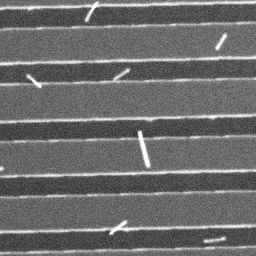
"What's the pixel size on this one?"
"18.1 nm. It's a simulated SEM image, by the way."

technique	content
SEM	lines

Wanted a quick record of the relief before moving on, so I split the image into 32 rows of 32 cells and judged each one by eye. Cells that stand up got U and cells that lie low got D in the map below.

UUUUUUUUUUUUUUUUUUUUUUDDDDDDDDDD
DDDDDDDDDDDDDDDDDDDDDDDDDDDDDDDD
DDDDDDDDDDDDDDDDDDDDDDDDDDDDDDDD
DDDDDDDDDUUUUUUUUUUUUUUUUUUUUUUU
UUUUUUUUUUUUUUUUUUUUUUUUUUUUUUUU
UUUUUUUUUUUUUUUUUUUUUUUUUUUUUUUU
UUUUUUUUUUUUUUUUUUUUUUUUUUUUUUUU
UUUUUUUUUUUUUUUUUUDDDDDDDDDDDDDD
DDDDDDDDDDDDDDDDDDDDDDDDDDDDDDDD
DDDDDDDDDDDDDDDDDDDDDDDDDDDDDDDD
DDDDUUUUUUUUUUUUUUUUUUUUUUUUUUUU
UUUUUUUUUUUUUUUUUUUUUUUUUUUUUUUU
UUUUUUUUUUUUUUUUUUUUUUUUUUUUUUUU
UUUUUUUUUUUUUUUUUUUUUUUUUUUUUUUU
UUUUUUUUUUUUUUUUUUUUUUUUUUUUUUUU
DDDDDDDDDDDDDDDDDDDDDDDDDDDDDDDD
DDDDDDDDDDDDDDDDDDDDDDDDDDDDDDDD
DDDDDDDDDDDUUUUUUUUUUUUUUUUUUUUU
UUUUUUUUUUUUUUUUUUUUUUUUUUUUUUUU
UUUUUUUUUUUUUUUUUUUUUUUUUUUUUUUU
UUUUUUUUUUUUUUUUUUUUUUUUUUUUUUUU
UUUUUUUUUUUUUUUUUUUUUUUUDDDDDDDD
DDDDDDDDDDDDDDDDDDDDDDDDDDDDDDDD
DDDDDDDDDDDDDDDDDDDDDDDDDDDDDDDD
DDDDDUUUUUUUUUUUUUUUUUUUUUUUUUUU
UUUUUUUUUUUUUUUUUUUUUUUUUUUUUUUU
UUUUUUUUUUUUUUUUUUUUUUUUUUUUUUUU
UUUUUUUUUUUUUUUUUUUUUUUUUUUUUUUU
UUUUUUUUUUUUUUUUUUUUUUDDDDDDDDDD
DDDDDDDDDDDDDDDDDDDDDDDDDDDDDDDD
DDDDDDDDDDDDDDDDDDDDDDDDDDDDDDDD
DDDDDDDDUUUUUUUUUUUUUUUUUUUUUUUU